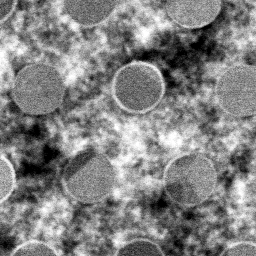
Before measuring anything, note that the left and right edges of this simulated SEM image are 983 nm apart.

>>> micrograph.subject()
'raised bodies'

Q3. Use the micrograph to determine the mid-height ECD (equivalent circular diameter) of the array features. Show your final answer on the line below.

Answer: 200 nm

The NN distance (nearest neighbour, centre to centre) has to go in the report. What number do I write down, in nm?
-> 382